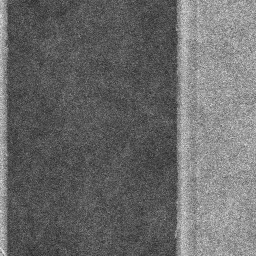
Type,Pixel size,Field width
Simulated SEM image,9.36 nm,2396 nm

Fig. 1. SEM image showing one or a few lines or trenches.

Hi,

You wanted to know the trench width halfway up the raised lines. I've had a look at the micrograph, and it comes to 1710 nanometers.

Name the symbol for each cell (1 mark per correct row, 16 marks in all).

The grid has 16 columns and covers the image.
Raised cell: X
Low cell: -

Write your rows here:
-----------XXXXX
------------XXXX
------------XXXX
------------XXXX
------------XXXX
-----------XXXXX
-----------XXXXX
-----------XXXXX
-----------XXXXX
-----------XXXXX
-----------XXXXX
-----------XXXXX
-----------XXXXX
-----------XXXXX
-----------XXXXX
-----------XXXXX